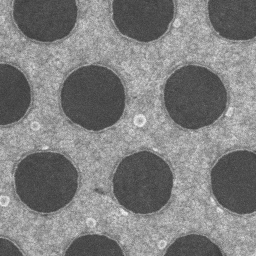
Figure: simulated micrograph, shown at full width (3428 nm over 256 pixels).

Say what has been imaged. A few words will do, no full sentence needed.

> raised bodies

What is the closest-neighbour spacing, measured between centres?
1290 nanometres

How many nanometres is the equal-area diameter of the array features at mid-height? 870